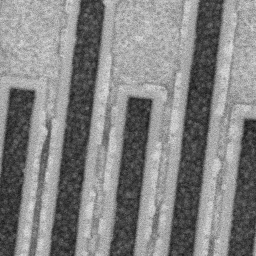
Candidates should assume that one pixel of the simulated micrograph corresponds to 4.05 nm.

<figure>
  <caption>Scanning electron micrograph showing parallel lines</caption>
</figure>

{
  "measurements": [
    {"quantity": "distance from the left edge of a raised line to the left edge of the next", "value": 238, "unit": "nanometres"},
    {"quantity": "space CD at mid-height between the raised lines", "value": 149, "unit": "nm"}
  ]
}